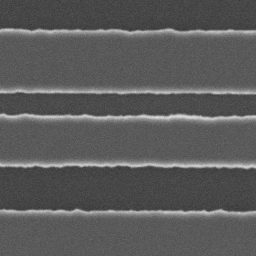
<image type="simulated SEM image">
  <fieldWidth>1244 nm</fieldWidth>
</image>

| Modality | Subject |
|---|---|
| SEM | lines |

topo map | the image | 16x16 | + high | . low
................
................
++++++++++++++++
++++++++++++++++
++++++++++++++++
++++++++++++++++
++++++++++++++++
++++++++++++++++
++++++++++++++++
++++++++++++++++
................
................
................
++++++++++++++++
++++++++++++++++
++++++++++++++++